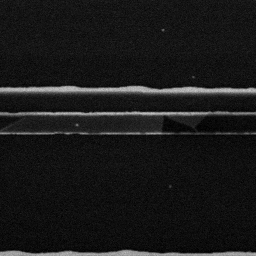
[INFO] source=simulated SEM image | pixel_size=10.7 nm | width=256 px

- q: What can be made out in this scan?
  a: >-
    lines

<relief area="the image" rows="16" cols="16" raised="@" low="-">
----------------
----------------
----------------
----------------
----------------
----------------
@@@@@@@@@@@@@@@@
@@@@@@@@@@@@@@@@
----------------
----------------
----------------
----------------
----------------
----------------
----------------
----------------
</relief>